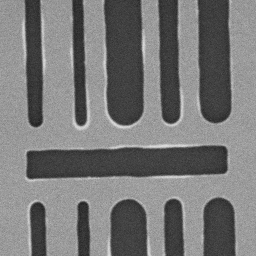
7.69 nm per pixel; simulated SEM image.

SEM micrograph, groups of lines, slits or small figures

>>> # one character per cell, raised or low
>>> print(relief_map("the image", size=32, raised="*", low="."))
***..****..**.....**..***....***
***..****..**.....**..***....***
***..****..**.....**..***....***
***..****..**.....**..***....***
***..****..**.....**..***....***
***..****..**.....**..***....***
***..****..**.....**..***....***
***...***..**.....**..***....***
***...***..**.....**..***....***
***...***..**.....**..***....***
***...***..**.....**...**....***
***..****..**.....**...**....***
***..****..**.....**...**....***
***..****..**.....**...**....***
***..****..***....**...**....***
****.****..***...****.**********
********************************
********************************
*************...............****
***..........................***
***..........................***
***.........................****
****.***************************
********************************
********************************
****.*****.***....***..***...***
****..****.***....**...**....***
****..****.***....**...**....***
****..****.***....**...**....***
****..****.***....**...**....***
****..****.***.....*...**.....**
****..****.***.....**..**.....**